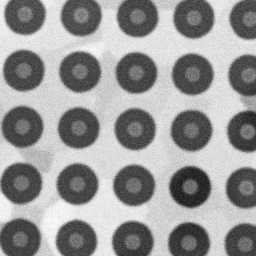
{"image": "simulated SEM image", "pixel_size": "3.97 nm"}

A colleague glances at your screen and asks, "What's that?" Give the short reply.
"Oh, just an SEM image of an array of small figures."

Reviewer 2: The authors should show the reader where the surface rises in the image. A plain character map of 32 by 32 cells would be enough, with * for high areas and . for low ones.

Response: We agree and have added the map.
*....***....***....***....***...
......**.....**.....**.....**...
*.....**.....**.....**.....**...
*....***....***....***.....**...
**********.*****..*****...****..
********************************
**..*****..*********************
*....***....***....***....***...
......*......*......**.....**...
......*......*......*......**...
*....***....***....***....***...
*********..*****..*****...***...
********************************
**..*****..*********************
*....***....***....***....***...
.....**.....**.....**.....***...
.....**.....**.....**......*....
*....***....***....***....***...
**.******..*****..****...****...
********************************
**..*****..*********************
.....***....***....***....***...
.....**.....**.....**.....**....
.....**.....**.....**.....**....
.....**.....**.....**.....**....
**.******..****...****...****...
********************************
**..*****.**********************
.....**.....***....***...****...
.....**.....**.....**.....**....
.....**.....**.....**.....**....
.....**.....**.....**.....**....